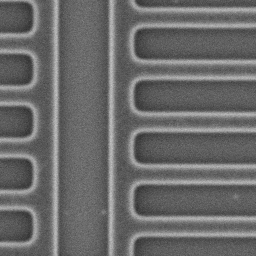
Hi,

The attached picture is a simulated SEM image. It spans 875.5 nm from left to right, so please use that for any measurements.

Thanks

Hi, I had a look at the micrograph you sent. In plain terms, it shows groups of lines, slits or small figures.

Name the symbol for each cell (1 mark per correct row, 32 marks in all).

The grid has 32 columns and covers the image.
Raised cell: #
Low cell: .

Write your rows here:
....###.......###...............
....###.......##################
....###.......##################
....###.......###...............
#######.......###...............
#######.......###...............
#######.......###...............
....###.......###...............
....###.......##################
....###.......##################
....###.......###...............
#######.......###...............
#######.......###...............
....###.......###...............
....###.......##################
....###.......##################
....###.......###...............
#######.......###...............
#######.......###...............
#######.......###...............
....###.......###...............
....###.......##################
....###.......##################
....###.......###...............
#######.......###...............
#######.......###...............
....###.......###...............
....###.......##################
....###.......##################
....###.......####..............
#######.......###...............
#######.......##................